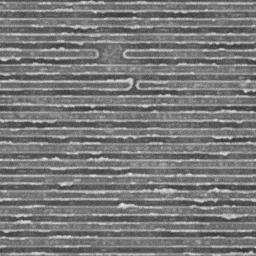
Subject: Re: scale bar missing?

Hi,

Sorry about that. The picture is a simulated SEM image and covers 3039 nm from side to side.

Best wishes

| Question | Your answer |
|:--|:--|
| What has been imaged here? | parallel lines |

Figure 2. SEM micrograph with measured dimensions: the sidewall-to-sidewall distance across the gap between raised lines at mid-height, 81.6 nanometres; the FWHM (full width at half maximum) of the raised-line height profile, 105 nm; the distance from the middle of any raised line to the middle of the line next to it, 186 nm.